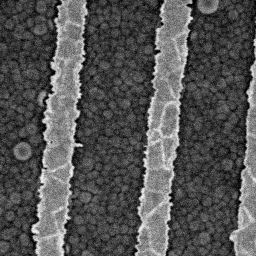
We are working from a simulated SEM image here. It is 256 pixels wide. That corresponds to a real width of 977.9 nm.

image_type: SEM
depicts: one or a few lines or trenches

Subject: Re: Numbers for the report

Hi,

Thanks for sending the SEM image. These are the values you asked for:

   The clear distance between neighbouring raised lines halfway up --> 274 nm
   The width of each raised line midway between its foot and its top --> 105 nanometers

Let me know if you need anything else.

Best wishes